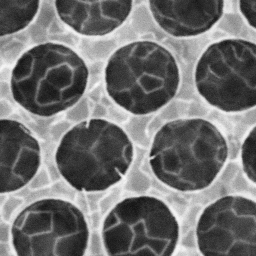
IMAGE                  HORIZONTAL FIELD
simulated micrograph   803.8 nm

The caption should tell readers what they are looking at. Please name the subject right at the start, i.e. holes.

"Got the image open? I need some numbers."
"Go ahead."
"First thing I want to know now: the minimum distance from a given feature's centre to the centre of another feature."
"282 nm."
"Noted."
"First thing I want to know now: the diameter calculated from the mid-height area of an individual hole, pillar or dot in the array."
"238 nanometers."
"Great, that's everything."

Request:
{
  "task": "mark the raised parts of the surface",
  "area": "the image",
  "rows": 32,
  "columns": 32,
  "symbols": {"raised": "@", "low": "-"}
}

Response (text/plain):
-----@@----------@----------@@--
-----@@---------@@@---------@@--
----@@@@--------@@@--------@@@@-
---@@@@@@------@@@@@-------@@@@-
-@@@@@@@@@@--@@@@@@@@@---@@@@@@@
@@@@@---@@@@@@@@----@@@@@@------
@@@------@@@@@-------@@@@-------
@@--------@@@---------@@@-------
@@---------@@---------@@--------
@----------@@----------@--------
@----------@@---------@@--------
@----------@@---------@@@-------
@@--------@@@@-------@@@@-------
@@@------@@@@@@-----@@@@@@@-----
@@@@@--@@@@@@@@@@@@@@@@@@@@@@@@@
---@@@@@@@-----@@@@@@------@@@@@
----@@@@--------@@@@--------@@@-
-----@@@--------@@@---------@@--
-----@@----------@@----------@--
-----@@----------@@---------@@--
-----@@---------@@@---------@@--
-----@@---------@@@---------@@--
----@@@@-------@@@@@-------@@@@-
---@@@@@@-----@@@@@@@-----@@@@@@
@@@@@@@@@@@@@@@@@--@@@@@@@@@--@@
@@@@-----@@@@@-------@@@@@------
@@--------@@@---------@@@-------
@@---------@@---------@@@-------
@----------@@---------@@@-------
@----------@@---------@@--------
@----------@@---------@@@-------
@@---------@@---------@@@-------